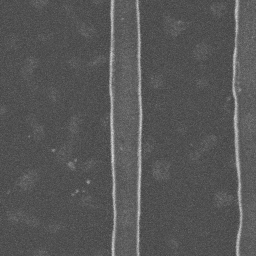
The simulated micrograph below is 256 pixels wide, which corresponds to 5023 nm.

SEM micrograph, one or a few lines or trenches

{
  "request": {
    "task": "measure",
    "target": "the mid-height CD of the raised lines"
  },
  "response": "531 nm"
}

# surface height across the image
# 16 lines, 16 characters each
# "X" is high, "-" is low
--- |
-------XX------X
-------XX------X
-------XX------X
-------XX------X
-------XX------X
-------XX------X
-------XX------X
-------XX------X
-------XX------X
-------XX------X
-------XX------X
-------XX------X
-------XX------X
-------XX------X
-------XX------X
-------XX------X